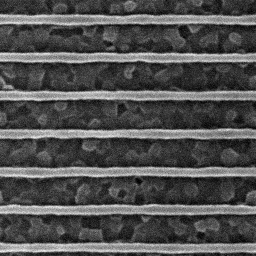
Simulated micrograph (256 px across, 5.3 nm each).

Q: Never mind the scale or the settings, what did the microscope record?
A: parallel lines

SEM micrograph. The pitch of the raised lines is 202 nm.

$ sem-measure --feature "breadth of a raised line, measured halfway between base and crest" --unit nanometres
44.4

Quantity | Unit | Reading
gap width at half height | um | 0.159